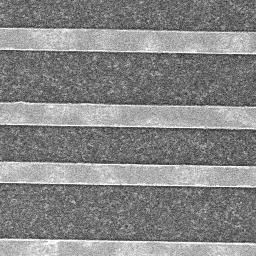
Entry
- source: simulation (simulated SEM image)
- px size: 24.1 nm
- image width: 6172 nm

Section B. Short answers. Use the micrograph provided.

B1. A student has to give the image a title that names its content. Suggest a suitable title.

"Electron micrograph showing one or a few lines or trenches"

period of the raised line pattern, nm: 1610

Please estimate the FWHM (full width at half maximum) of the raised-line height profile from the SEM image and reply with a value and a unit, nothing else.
506 nanometres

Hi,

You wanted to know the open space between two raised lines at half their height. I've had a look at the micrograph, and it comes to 1300 nm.